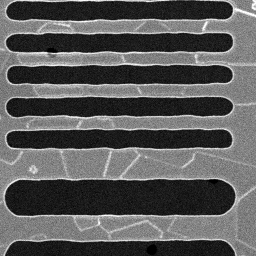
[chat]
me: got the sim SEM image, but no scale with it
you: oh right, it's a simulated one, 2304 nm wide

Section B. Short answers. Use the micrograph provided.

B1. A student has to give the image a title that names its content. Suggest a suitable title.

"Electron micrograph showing groups of lines, slits or small figures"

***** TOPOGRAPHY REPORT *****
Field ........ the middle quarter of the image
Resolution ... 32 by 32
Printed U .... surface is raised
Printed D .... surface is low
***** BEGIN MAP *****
DDDDDDDDDDDDDDDDDDDDDDDDDDDDDDDD
DDDDDDDDDDDDDDDDDDDDDDDDDDDDDDDD
DDDDDDDDDDDDDDDDDDDDDDDDDDDDDDDD
DDDDDDDDDDDDDDDDDDDDDDDDDDDDDDDD
DDDDDDDDDDDDDDDDDDDDDDDDDDDDDDDD
UUUUUUUUUUUUUUUUUUUUUUUUUUUUUUUU
UUUUUUUUUUUUUUUUUUUUUUUUUUUUUUUU
UUUUUUUUUUUUUUUUUUUUUUUUUUUUUUUU
DDDDDDDDDDDDDDDDDDDDDDDDDDDDDDDD
DDDDDDDDDDDDDDDDDDDDDDDDDDDDDDDD
DDDDDDDDDDDDDDDDDDDDDDDDDDDDDDDD
DDDDDDDDDDDDDDDDDDDDDDDDDDDDDDDD
DDDDDDDDDDDDDDDDDDDDDDDDDDDDDDDD
UUUUDDUUUUUUUUUUUUUUUUUUUUUUUUUU
UUUUUUUUUUUUUUUUUUUUUUUUUUUUUUUU
UUUUUUUUUUUUUUUUUUUUUUUUUUUUUUUU
DDDDDDDDDDDDDDDDDDDDDDDDDDDDDDDD
DDDDDDDDDDDDDDDDDDDDDDDDDDDDDDDD
DDDDDDDDDDDDDDDDDDDDDDDDDDDDDDDD
DDDDDDDDDDDDDDDDDDDDDDDDDDDDDDDD
DDDDDDDDDDDDDDDDDDDDDDDDDDDDDDDD
UUUUUUUUUUUUUUUUUUUUUUUUUUUUUUUU
UUUUUUUUUUUUUUUUUUUUUUUUUUUUUUUU
UUUUUUUUUUUUUUUUUUUUUUUUUUUUUUUU
UUUUUUUUUUUUUUUUUUUUUUUUUUUUUUUU
UUUUUUUUUUUUUUUUUUUUUUUUUUUUUUUU
UUUUUUUUUUUUUUUUUUUUUUUUUUUUUUUU
UUUUUUUUUUUUUUUUUUUUUUUUUUUUUUUU
UUUUUUUUUUUUUUUUUUUUUUUUUUUUUUUU
DDDDDDDDDDDDDDDDDDDDDDDDDDDDDDDD
DDDDDDDDDDDDDDDDDDDDDDDDDDDDDDDD
DDDDDDDDDDDDDDDDDDDDDDDDDDDDDDDD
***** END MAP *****